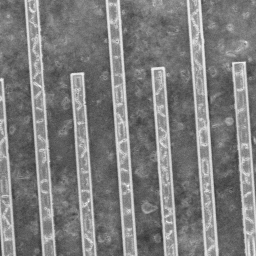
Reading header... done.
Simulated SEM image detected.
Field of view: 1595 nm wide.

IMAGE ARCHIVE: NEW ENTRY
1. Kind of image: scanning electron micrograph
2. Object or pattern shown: parallel lines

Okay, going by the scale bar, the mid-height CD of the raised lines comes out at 73.8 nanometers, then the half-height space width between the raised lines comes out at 178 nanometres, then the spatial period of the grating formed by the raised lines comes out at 0.253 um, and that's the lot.